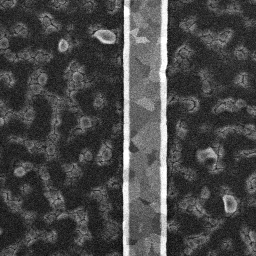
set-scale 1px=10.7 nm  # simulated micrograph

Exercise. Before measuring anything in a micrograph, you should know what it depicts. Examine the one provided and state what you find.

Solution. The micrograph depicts one or a few lines or trenches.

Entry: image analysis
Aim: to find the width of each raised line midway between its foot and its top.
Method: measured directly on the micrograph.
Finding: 416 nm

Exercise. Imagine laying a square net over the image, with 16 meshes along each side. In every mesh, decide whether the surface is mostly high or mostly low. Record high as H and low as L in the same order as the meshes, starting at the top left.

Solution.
LLLLLLLLHHLLLLLL
LLLLLLLLHHLLLLLL
LLLLLLLLHHLLLLLL
LLLLLLLLHHLLLLLL
LLLLLLLLHHLLLLLL
LLLLLLLLHHLLLLLL
LLLLLLLLHHLLLLLL
LLLLLLLLHHLLLLLL
LLLLLLLLHHLLLLLL
LLLLLLLLHHLLLLLL
LLLLLLLLHHLLLLLL
LLLLLLLLHHLLLLLL
LLLLLLLLHHLLLLLL
LLLLLLLLHHLLLLLL
LLLLLLLLHHLLLLLL
LLLLLLLLHHLLLLLL